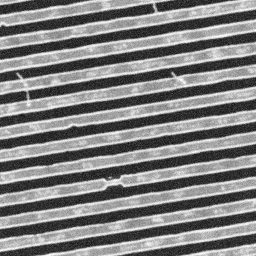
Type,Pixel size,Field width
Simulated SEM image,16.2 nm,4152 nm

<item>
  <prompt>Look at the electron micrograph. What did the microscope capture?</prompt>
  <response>parallel lines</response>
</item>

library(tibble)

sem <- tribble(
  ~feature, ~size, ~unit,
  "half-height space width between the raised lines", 0.202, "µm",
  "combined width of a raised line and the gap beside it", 359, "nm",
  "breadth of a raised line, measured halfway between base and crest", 0.156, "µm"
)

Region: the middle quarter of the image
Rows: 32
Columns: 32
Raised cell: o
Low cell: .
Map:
............ooooooooooooooo.....
......ooooooooooooooo...........
oooooooooooooo..................
oooooooo...................ooooo
o.....................oooooooooo
................oooooooooooooo..
..........ooooooooooooooo.......
...oooooooooooooooo.............
ooooooooooooo...................
ooooo.....................oooooo
....................oooooooooooo
.............ooooooooooooooo....
.......oooooooooooooo...........
.ooooooooooooooo................
ooooooooo.....................oo
oo.....................ooooooooo
.................ooooooooooooooo
...........oooooooooooooo.......
....oooooooooooooooo............
oooooooooooooo..................
oooooooo...................ooooo
o....................ooooooooooo
...............ooooooooooooooo..
........oooooooooooooooo........
...ooooooooooooooo..............
ooooooooooo....................o
ooooo...................oooooooo
...................ooooooooooooo
..............ooooooooooooo.....
......ooooooooooooooo...........
ooooooooooo.....................
ooooooooo...................oooo